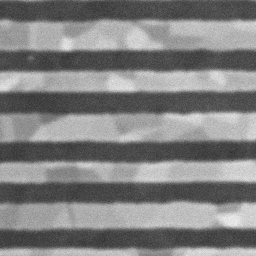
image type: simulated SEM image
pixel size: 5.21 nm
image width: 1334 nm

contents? lines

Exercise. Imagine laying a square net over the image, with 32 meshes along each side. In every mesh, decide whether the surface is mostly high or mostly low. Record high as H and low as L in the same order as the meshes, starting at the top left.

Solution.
LLLLLLLLLLLLLLLLLLLLLLLLLLLLLLLL
LLLLLLLLLLLLLLLLLLLLLLLLLLLLLLLL
LLLLLLLLLLLLLLLLLLLLLLLLLLLLLLLL
HHHHHHHHHHHHHHHHHHHHHHHHHHHHHHHH
HHHHHHHHHHHHHHHHHHHHHHHHHHHHHHHH
HHHHHHHHHHHHHHHHHHHHHHHHHHHHHHHH
LLLLLLLLLLLLLLLLLLLLLLLLLLLLLLLL
LLLLLLLLLLLLLLLLLLLLLLLLLLLLLLLL
LLLLLLLLLLLLLLLLLLLLLLLLLLLLLLLL
HHHHHHHHHHHHHHHHHHHHHHHHHHHHHHHH
HHHHHHHHHHHHHHHHHHHHHHHHHHHHHHHH
LLLLLLLLLLLLLLLLLLLLLLLLLLLLLLLL
LLLLLLLLLLLLLLLLLLLLLLLLLLLLLLLL
LLLLLLLLLLLLLLLLLLLLLLLLLLLLLLLL
HHHHHHHHHHHHHHHHHHHHHHHHHHHHHHHH
HHHHHHHHHHHHHHHHHHHHHHHHHHHHHHHH
HHHHHHHHHHHHHHHHHHHHHHHHHHHHHHHH
HHHHHHHHHHLHHHHHHHHHHHHHHLLLLLLL
LLLLLLLLLLLLLLLLLLLLLLLLLLLLLLLL
LLLLLLLLLLLLLLLLLLLLLLLLLLLLLLLL
HHHHHHHHHHHHHHLHLLLHHHHHHHHHHHHH
HHHHHHHHHHHHHHHHHHHHHHHHHHHHHHHH
HHHHHHHHHHHHHHHHHHHHHHHHHHHHHHHH
LLLLLLLLLLLLLLLLLLLLLLLLLLLLLLLL
LLLLLLLLLLLLLLLLLLLLLLLLLLLLLLLL
LLLLLLLHHHLLLLLLLLLLLHHHHLLLLHHL
HHHHHHHHHHHHHHHHHHHHHHHHHHHHHHHH
HHHHHHHHHHHHHHHHHHHHHHHHHHHHHHHH
HHHHHHHLLLLHHLLLLLLLLLLLHHLLLLLL
LLLLLLLLLLLLLLLLLLLLLLLLLLLLLLLL
LLLLLLLLLLLLLLLLLLLLLLLLLLLLLLLL
HHHHHHHHHHHHHHHHHHHHHHHHHHHHHHHH